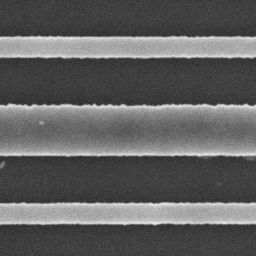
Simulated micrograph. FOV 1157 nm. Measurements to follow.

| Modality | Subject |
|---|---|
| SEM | lines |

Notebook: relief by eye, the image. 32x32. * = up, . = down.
................................
................................
................................
................................
................................
********************************
********************************
................................
................................
................................
................................
................................
................................
********************************
********************************
********************************
********************************
********************************
********************************
........*...*................*..
................................
................................
................................
................................
................................
.***..*****.*******.************
********************************
********************************
................................
................................
................................
................................